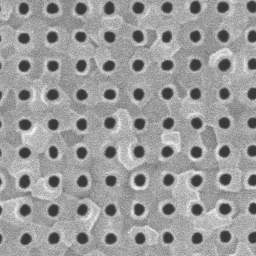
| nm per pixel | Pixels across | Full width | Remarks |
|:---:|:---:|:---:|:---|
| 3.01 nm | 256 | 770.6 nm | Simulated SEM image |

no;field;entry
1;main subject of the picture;a regular array of holes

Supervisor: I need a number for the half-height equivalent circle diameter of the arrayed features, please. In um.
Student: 0.035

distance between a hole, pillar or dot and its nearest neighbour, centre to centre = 84.4 nanometres